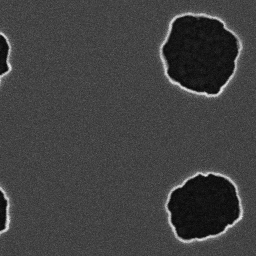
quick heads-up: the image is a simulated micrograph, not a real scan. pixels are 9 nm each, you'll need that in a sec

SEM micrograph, holes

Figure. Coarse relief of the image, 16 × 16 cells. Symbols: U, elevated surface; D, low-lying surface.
UUUUUUUUUUUUUUUU
UUUUUUUUUUUDDDUU
UUUUUUUUUUDDDDDU
UUUUUUUUUUDDDDDU
UUUUUUUUUUUDDDDU
UUUUUUUUUUUUDDUU
UUUUUUUUUUUUUUUU
UUUUUUUUUUUUUUUU
UUUUUUUUUUUUUUUU
UUUUUUUUUUUUUUUU
UUUUUUUUUUUUUUUU
UUUUUUUUUUUUDDUU
UUUUUUUUUUUDDDDU
UUUUUUUUUUUDDDDU
UUUUUUUUUUUDDDUU
UUUUUUUUUUUUUUUU